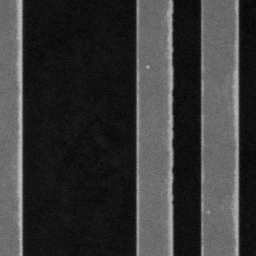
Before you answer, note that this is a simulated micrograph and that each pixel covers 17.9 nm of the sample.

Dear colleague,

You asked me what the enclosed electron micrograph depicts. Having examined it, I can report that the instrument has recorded lines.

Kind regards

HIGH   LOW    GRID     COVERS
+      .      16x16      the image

+........++..++.
+........++..++.
+........++..++.
+........++..++.
+........++..++.
+........++..++.
+........++..++.
+........++..++.
+........++..++.
+........++..++.
+........++..++.
+........++..++.
+........++..++.
+........++..++.
+........++..++.
+........++..++.